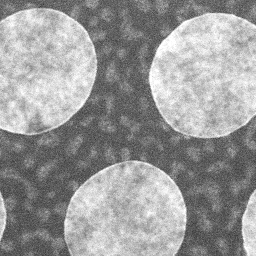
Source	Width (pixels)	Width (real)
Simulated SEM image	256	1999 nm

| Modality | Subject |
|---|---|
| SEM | raised bodies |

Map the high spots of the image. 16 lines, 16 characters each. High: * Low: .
................
*****......*****
******....******
******....******
******...*******
******...*******
*****.....******
****......******
............**..
................
.......***......
.....******.....
....*******.....
....********...*
....********...*
....*******....*